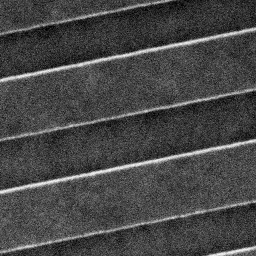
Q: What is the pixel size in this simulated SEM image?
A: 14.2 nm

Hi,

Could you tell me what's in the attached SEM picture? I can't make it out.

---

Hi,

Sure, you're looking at lines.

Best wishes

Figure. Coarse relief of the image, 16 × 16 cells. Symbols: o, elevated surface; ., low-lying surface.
oooooooo........
ooo.............
............oooo
.......ooooooooo
..oooooooooooooo
oooooooooooooooo
oooooooooooo....
ooooooo.........
oo..............
............oooo
.......ooooooooo
..oooooooooooooo
oooooooooooooooo
oooooooooooo....
ooooooo.........
o...............